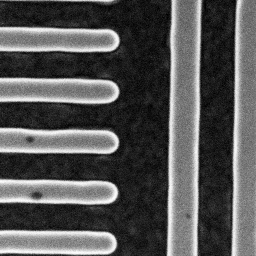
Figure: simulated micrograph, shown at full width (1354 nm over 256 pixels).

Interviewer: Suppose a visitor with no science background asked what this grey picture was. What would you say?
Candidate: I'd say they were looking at groups of lines, slits or small figures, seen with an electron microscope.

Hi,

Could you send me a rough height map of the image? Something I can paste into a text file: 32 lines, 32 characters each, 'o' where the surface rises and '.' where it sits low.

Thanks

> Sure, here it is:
......................ooo.....oo
......................ooo.....oo
......................ooo....ooo
oooo.................oooo....ooo
ooooooooooooooo......oooo....ooo
ooooooooooooooo......oooo....ooo
.....................oooo....ooo
.....................oooo....ooo
.....................oooo....ooo
.....................oooo....ooo
oooooooooooooo.......oooo....ooo
ooooooooooooooo......oooo....ooo
oooooooooooooo.......oooo....ooo
.....................oooo....ooo
.....................oooo....ooo
.....................oooo....ooo
oooooooooooooo.......oooo....ooo
ooooooooooooooo......oooo....ooo
ooooooooooooooo......oooo....ooo
.....................oooo....ooo
.....................oooo....ooo
.....................oooo....ooo
.....................oooo....ooo
ooooooooooooooo......oooo....ooo
ooooooooooooooo......oooo....ooo
.....................oooo....ooo
.....................oooo....ooo
.....................oooo....ooo
.....................oooo....ooo
oooooooooooooo.......oooo....ooo
ooooooooooooooo......oooo....ooo
o.oooooooooooo.......oooo....ooo